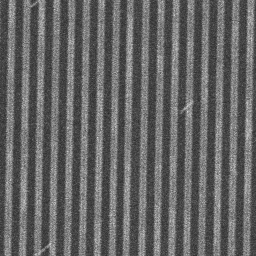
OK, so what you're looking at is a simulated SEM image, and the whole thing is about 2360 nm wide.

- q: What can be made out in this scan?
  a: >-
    parallel lines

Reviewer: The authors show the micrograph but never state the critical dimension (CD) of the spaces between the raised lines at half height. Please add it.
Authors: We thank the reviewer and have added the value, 88.7 nm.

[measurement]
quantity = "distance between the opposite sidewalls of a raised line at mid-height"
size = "0.053 µm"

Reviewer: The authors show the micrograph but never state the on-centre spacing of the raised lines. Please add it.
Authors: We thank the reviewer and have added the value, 138 nanometres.